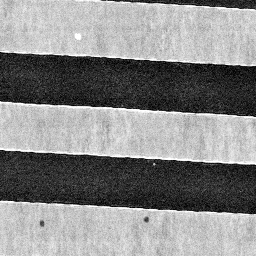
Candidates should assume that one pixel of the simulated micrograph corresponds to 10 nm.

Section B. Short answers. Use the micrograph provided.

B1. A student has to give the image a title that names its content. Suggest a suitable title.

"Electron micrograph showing lines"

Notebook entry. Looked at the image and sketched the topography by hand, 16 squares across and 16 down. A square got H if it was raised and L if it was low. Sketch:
HHHHHHHHHHHHHHLL
HHHHHHHHHHHHHHHH
HHHHHHHHHHHHHHHH
LLLLLHHHHHHHHHHH
LLLLLLLLLLLLLLLL
LLLLLLLLLLLLLLLL
HHLLLLLLLLLLLLLL
HHHHHHHHHHHHHHHH
HHHHHHHHHHHHHHHH
LLLHHHHHHHHHHHHH
LLLLLLLLLLLLLLLL
LLLLLLLLLLLLLLLL
LLLLLLLLLLLLLLLL
HHHHHHHHHHHHHHHH
HHHHHHHHHHHHHHHH
HHHHHHHHHHHHHHHH